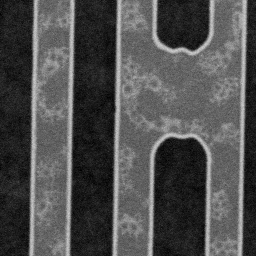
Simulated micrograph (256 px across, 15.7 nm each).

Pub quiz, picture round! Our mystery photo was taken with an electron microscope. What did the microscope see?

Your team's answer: one or a few lines or trenches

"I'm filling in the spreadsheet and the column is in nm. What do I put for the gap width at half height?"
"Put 736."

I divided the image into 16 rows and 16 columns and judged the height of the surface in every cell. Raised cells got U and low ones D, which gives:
DDUUUDDUUUDDDUUD
DDUUDDDUUUDDDUUD
DDUUDDDUUUDDDUUD
DDUUDDDUUUUUUUUD
DDUUDDDUUUUUUUUD
DDUUDDDUUUUUUUUD
DDUUDDDUUUUUUUUD
DDUUDDDUUUUUUUUD
DDUUDDDUUUUDUUUD
DDUUDDDUUUDDDUUD
DDUUDDDUUDDDDUUD
DDUUDDDUUDDDDUUD
DDUUDDDUUDDDDUUD
DDUUDDDUUDDDDUUD
DDUUDDDUUDDDDUUD
DDUUDDDUUDDDDUUD